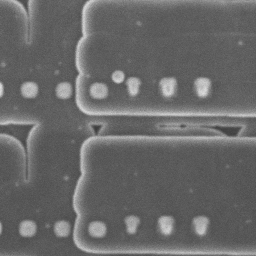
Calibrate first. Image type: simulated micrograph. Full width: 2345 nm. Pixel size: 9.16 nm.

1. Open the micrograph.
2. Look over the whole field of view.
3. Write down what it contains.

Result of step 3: wiring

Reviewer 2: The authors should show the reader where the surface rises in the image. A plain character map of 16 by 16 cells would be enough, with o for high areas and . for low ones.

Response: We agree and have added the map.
.....ooooooooooo
.....ooooooooooo
.....ooooooooooo
.....ooooooooooo
.....ooooooooooo
.....ooooooooooo
.....ooooooooooo
................
................
.....ooooooooooo
.....ooooooooooo
.....ooooooooooo
.....ooooooooooo
.....ooooooooooo
.....ooooooooooo
.....ooooooooooo